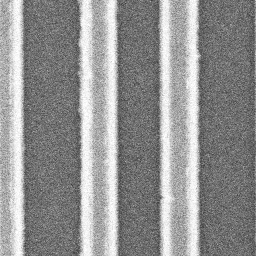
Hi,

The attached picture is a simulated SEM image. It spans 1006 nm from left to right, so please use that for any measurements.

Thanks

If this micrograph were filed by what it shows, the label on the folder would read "one or a few lines or trenches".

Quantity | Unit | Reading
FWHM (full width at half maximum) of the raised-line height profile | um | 0.106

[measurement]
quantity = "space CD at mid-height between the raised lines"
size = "0.237 microns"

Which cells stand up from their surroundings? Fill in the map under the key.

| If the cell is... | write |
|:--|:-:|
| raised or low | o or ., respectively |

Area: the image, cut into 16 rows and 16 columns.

o....oo...oo....
o....oo...oo....
o....oo...oo....
o....oo...oo....
o....oo...oo....
o....oo...oo....
o....oo...oo....
o....oo...oo....
o....oo...oo....
o....oo...oo....
o....oo...oo....
o....oo...oo....
o....oo...oo....
o....oo...oo....
o....oo...oo....
o....oo...oo....